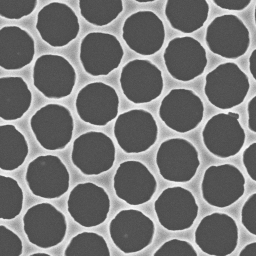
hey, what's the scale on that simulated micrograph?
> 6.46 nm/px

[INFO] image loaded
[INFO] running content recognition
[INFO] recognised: a regular array of holes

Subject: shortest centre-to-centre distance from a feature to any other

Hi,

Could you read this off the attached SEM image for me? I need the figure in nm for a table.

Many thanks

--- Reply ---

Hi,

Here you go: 314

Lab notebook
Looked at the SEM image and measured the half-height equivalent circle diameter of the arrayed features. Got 280 nanometers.